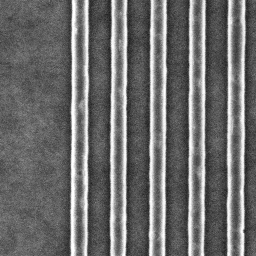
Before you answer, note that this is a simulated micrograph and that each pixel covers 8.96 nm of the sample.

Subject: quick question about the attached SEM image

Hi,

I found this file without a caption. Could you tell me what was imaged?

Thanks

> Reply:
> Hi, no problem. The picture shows parallel lines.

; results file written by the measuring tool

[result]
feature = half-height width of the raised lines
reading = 133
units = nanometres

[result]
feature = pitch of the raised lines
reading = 350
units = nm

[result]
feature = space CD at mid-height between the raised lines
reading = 0.217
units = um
